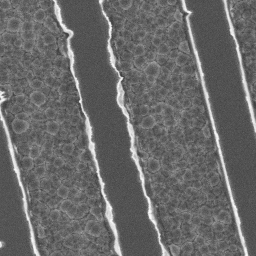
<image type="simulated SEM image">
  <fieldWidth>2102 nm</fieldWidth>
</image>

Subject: one or a few lines or trenches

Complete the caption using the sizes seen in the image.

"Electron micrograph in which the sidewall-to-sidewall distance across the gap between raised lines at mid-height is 0.656 um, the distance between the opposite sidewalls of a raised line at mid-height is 0.344 micrometres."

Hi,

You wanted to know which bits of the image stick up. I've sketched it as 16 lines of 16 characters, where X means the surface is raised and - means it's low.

----XX------XX--
----XXX-----XX--
----XXX-----XXX-
----XXX-----XXX-
----XXX------XX-
-----XXX-----XX-
-----XXX-----XXX
-----XXX-----XXX
X-----XX-----XXX
X-----XX------XX
X-----XXX-----XX
X-----XXX-----XX
XX-----XX-----XX
XX-----XX------X
XX-----XXX-----X
XX-----XXX-----X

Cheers